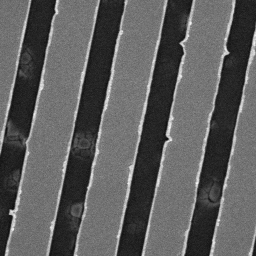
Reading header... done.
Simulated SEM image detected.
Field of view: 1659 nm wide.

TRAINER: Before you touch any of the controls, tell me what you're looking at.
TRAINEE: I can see one or a few lines or trenches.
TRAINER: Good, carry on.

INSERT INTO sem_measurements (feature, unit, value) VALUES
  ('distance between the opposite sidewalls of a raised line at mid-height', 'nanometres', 266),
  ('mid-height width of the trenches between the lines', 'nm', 169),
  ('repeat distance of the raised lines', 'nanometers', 432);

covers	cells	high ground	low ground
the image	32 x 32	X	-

XXXX---XXXXX----XXXXX---XXXXX---
XXXX---XXXXX----XXXXX---XXXXX---
XXX----XXXXX---XXXXX----XXXXX---
XXX---XXXXXX---XXXXX---XXXXXX---
XXX---XXXXX----XXXXX---XXXXX----
XXX---XXXXX----XXXXX---XXXXX----
XXX---XXXXX---XXXXXX---XXXXX---X
XX----XXXXX---XXXXX----XXXXX---X
XX---XXXXXX---XXXXX---XXXXXX---X
XX---XXXXX----XXXXX---XXXXX----X
XX---XXXXX----XXXXX---XXXXX----X
XX---XXXXX---XXXXXX---XXXXX---XX
X----XXXXX---XXXXX----XXXXX---XX
X---XXXXXX---XXXXX---XXXXXX---XX
X---XXXXX----XXXXX---XXXXX----XX
X---XXXXX----XXXXX---XXXXX----XX
X---XXXXX---XXXXXX---XXXXX---XXX
----XXXXX---XXXXX----XXXXX---XXX
---XXXXXX---XXXXX---XXXXXX---XXX
---XXXXX----XXXXX---XXXXX----XXX
---XXXXX----XXXXX---XXXXX----XXX
---XXXXX---XXXXXX---XXXXX---XXXX
---XXXXX---XXXXX----XXXXX---XXXX
--XXXXXX---XXXXX----XXXXX---XXXX
--XXXXX----XXXXX---XXXXX----XXXX
--XXXXX----XXXXX---XXXXX----XXXX
-XXXXXX--XXXXXXX---XXXXX---XXXXX
--XXXXX---XXXXX----XXXXX---XXXXX
-XXXXXX---XXXXX---XXXXXX---XXXXX
-XXXXX----XXXXX---XXXXX----XXXXX
-XXXXX----XXXXX---XXXXX----XXXXX
-XXXXX---XXXXXX---XXXXX---XXXXX-